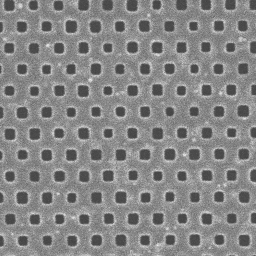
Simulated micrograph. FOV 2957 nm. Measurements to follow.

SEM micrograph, a regular array of holes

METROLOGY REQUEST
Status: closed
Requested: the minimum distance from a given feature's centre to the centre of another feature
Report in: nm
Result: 280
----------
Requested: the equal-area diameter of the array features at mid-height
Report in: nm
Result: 134